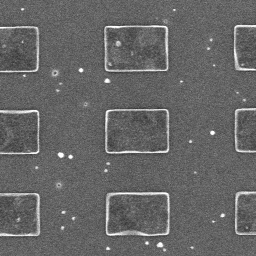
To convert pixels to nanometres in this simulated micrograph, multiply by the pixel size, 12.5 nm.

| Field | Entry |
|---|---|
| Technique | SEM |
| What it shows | wiring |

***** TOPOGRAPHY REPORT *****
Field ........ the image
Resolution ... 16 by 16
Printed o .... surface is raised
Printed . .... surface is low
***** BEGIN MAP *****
................
................
oo.....ooo.....o
oo.....ooo.....o
................
................
................
oo.....ooo.....o
oo.....ooo.....o
oo.....ooo......
................
................
oo.....ooo.....o
oo.....oooo....o
oo.....ooo.....o
................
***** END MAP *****